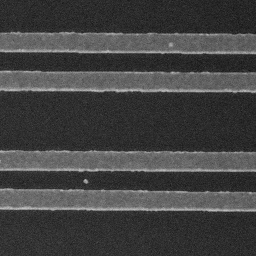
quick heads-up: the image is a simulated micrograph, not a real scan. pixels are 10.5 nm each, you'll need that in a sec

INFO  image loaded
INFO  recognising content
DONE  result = lines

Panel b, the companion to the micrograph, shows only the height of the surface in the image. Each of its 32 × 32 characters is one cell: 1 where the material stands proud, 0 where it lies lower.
00000000000000000000000000000000
00000000000000000000000000000000
00000000000000000000000000000000
00000000000000000000000000000000
11111111111111111111111111111111
11111111111111111111111111111111
00000000001111111111111111111111
00000000000000000000000000000000
00000000000000000000000000000000
11111111111111111111111111111111
11111111111111111111111111111111
00000000000000000000000000000000
00000000000000000000000000000000
00000000000000000000000000000000
00000000000000000000000000000000
00000000000000000000000000000000
00000000000000000000000000000000
00000000000000000000000000000000
00000000000000000000000000000000
11111111111111111111111111111111
11111111111111111111111111111111
00000000000000000000000000000000
00000000000000000000000000000000
00000000000000000000000000000000
11111111111111111111111111111111
11111111111111111111111111111111
00000000000000000000000000000000
00000000000000000000000000000000
00000000000000000000000000000000
00000000000000000000000000000000
00000000000000000000000000000000
00000000000000000000000000000000